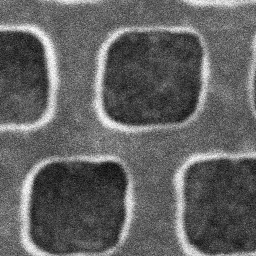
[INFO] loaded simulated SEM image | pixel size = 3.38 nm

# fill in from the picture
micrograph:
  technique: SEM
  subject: holes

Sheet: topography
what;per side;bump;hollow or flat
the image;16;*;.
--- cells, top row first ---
****************
****************
...****.....****
...****......***
...***.......***
...***.......***
...***......****
...****.....****
****************
****************
**......****....
**......***.....
**......***.....
**......***.....
**......***.....
**.....*****....